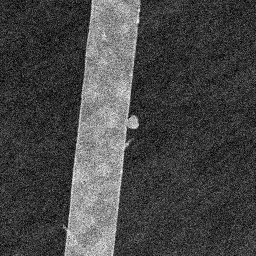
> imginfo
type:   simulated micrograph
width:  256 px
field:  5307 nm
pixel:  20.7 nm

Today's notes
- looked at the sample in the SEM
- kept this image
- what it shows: one or a few lines or trenches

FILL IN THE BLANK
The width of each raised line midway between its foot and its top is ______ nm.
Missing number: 987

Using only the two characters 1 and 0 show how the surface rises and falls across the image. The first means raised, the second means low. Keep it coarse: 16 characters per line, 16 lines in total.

0000001110000000
0000001110000000
0000011100000000
0000011100000000
0000011100000000
0000011100000000
0000011100000000
0000011100000000
0000011100000000
0000011100000000
0000011100000000
0000011100000000
0000111000000000
0000111000000000
0000111000000000
0000111000000000